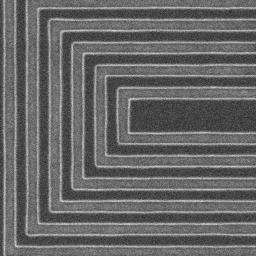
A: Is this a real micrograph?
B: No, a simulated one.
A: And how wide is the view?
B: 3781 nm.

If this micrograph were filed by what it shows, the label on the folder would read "groups of lines, slits or small figures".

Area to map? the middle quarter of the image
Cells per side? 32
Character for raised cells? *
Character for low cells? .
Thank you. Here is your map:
**...****.......................
**...***........................
**...***........................
**...***..**********************
**...***..**********************
**...***..**********************
**...***..****..................
**...***..***...................
**...***...**...................
**...***...**...****************
**...***...**...****************
**...***...**...****************
**...***...**...****************
**...***...**...****************
**...***...**...****************
**...***...**...****************
**...***..****..****************
**...***..****..................
**...***..****..................
**...***..****..................
**...***..**********************
**...***...*********************
**...***...*********************
**...***........................
**...***........................
**...****.......................
**...***************************
**...***************************
**...**....***********.....****.
**..............................
**..............................
********************************